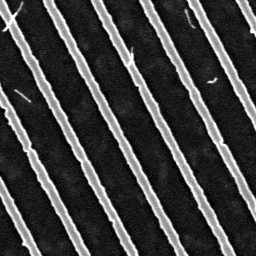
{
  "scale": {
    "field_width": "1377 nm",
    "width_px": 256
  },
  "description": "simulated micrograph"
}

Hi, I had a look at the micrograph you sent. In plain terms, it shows parallel lines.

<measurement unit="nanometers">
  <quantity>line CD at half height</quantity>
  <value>46.4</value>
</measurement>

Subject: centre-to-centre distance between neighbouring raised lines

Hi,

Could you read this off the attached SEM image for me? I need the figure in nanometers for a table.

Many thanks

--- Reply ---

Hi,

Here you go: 230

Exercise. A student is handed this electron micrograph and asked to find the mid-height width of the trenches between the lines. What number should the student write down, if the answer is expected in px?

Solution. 34.5